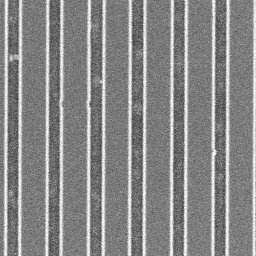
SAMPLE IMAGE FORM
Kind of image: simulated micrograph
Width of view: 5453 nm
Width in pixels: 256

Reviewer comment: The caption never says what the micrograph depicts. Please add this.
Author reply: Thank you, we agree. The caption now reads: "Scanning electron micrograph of parallel lines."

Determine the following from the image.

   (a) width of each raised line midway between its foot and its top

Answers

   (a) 591 nm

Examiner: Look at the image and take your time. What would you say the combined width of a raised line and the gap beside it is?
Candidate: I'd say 883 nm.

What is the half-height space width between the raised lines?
296 nm